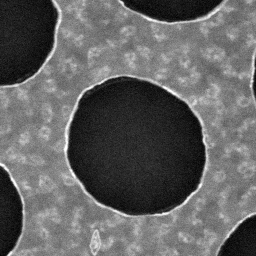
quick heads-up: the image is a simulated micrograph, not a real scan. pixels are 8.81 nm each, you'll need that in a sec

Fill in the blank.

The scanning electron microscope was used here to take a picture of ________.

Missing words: holes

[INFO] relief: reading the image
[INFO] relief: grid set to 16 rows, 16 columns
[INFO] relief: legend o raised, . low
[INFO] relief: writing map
....oooo......oo
....oooooooooooo
...ooooooooooooo
...ooooooooooooo
..oooooooooooooo
oooooo....oooooo
ooooo.......oooo
oooo........oooo
oooo.........ooo
oooo.........ooo
oooo.........ooo
.oooo.......oooo
.ooooo......oooo
.ooooooooooooooo
.oooooooooooooo.
.ooooooooooooo..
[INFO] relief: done